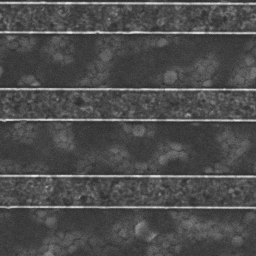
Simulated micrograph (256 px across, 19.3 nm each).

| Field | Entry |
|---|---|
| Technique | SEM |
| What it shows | one or a few lines or trenches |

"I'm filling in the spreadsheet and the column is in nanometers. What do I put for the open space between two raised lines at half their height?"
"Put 1090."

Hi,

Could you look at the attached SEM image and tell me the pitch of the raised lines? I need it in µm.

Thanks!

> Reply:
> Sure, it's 1.68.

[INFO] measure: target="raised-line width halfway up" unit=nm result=602